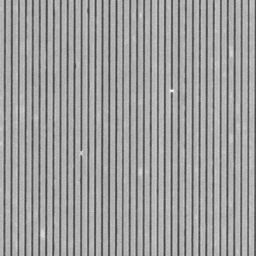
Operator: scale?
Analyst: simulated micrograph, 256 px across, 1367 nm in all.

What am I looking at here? parallel lines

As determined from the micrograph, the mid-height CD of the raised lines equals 27.4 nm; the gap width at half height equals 9.4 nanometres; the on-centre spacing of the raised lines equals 37.1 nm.